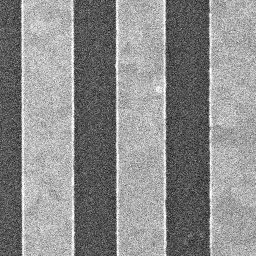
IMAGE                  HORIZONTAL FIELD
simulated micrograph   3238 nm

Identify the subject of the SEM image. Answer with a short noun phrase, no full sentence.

one or a few lines or trenches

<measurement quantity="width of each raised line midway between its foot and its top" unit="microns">0.626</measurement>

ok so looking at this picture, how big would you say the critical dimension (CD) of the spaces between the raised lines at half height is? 0.564 microns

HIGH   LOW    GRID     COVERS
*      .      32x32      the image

...******......******.....******
...******......*****......******
...******......*****......******
...******......******.....******
...******......******.....******
...******......******.....******
...******......******.....******
...******......******.....******
...******......******.....******
...******......******.....******
...******......******.....******
...******......******.....******
...******......******.....******
...******......******.....******
...******......******.....******
...******......******.....******
...******......******.....******
...******......******.....******
...******......******.....******
...******......******.....******
...******......******.....******
...******......******.....******
...******......******.....******
...******......******.....******
...******......******.....******
...******......******.....******
...******......******.....******
...******......******.....******
...******......******.....******
...******......******.....******
...******......******.....******
...******......******.....******